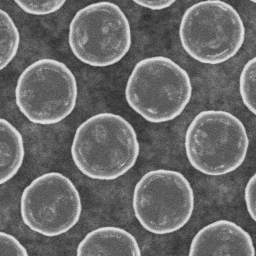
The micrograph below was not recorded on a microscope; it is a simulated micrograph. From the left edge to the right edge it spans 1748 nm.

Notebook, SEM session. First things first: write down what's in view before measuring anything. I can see a regular array of raised bodies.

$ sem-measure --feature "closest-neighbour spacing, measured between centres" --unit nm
536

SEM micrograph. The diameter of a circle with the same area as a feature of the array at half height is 419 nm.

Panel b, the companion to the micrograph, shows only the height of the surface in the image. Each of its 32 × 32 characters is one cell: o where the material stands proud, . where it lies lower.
..oooooo....oo....ooo....ooo....
....oo....ooooo........oooooo...
o........ooooooo.......ooooooo..
oo.......ooooooo.......ooooooo..
oo.......ooooooo.......ooooooo..
oo.......ooooooo.......ooooooo..
oo.......ooooooo........ooooo...
o.........ooooo....oo....ooo....
....oooo.........ooooo.........o
...oooooo.......ooooooo.......oo
..ooooooo.......oooooooo......oo
..ooooooo.......oooooooo......oo
..ooooooo.......ooooooo........o
...oooooo........oooooo........o
...ooooo....oo....oooo...oooo...
o.........oooooo........oooooo..
oo........ooooooo.......ooooooo.
ooo......oooooooo......oooooooo.
ooo......oooooooo......oooooooo.
ooo......oooooooo.......ooooooo.
oo........ooooooo.......oooooo..
oo.........oooo....oo.....oo....
o....ooo..........ooooo........o
....ooooo........ooooooo.......o
...ooooooo.......ooooooo.......o
...ooooooo.......ooooooo.......o
...ooooooo.......ooooooo.......o
...ooooooo.......oooooo.........
....ooooo.........oooo....oooo..
o..........ooooo.........oooooo.
oo........ooooooo.......ooooooo.
ooo.......ooooooo.......oooooooo